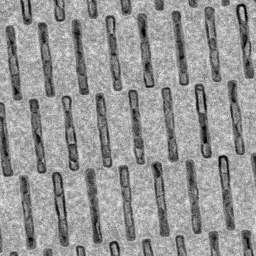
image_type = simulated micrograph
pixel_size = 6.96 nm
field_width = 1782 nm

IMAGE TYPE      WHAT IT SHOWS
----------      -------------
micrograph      a regular array of holes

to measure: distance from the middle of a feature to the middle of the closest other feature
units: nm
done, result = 231